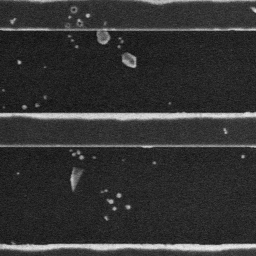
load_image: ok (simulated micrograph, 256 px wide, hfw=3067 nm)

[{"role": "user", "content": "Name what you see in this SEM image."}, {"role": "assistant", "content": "lines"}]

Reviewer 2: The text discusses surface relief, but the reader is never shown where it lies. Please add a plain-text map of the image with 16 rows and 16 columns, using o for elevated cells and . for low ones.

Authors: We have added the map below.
oooooooooooooooo
oooooooooooooooo
................
................
................
................
................
oooooooooooooooo
oooooooooooooooo
................
................
................
................
................
................
oooooooooooooooo